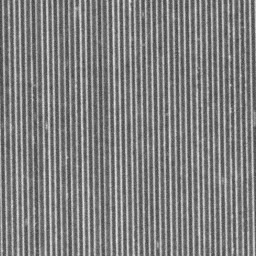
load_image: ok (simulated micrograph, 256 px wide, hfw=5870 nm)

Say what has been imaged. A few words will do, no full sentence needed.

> parallel lines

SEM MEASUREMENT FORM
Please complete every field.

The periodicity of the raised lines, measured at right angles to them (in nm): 252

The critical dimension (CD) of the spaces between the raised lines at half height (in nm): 112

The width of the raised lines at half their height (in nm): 149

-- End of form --